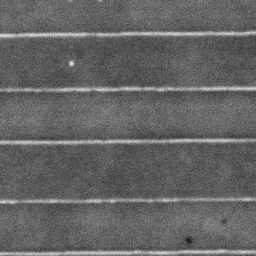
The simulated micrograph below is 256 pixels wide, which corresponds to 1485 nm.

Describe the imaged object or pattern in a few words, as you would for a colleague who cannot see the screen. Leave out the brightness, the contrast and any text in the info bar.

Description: lines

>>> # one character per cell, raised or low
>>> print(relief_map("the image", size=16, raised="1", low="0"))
0000000000000000
0000000000000000
1111111111111111
1111111111111111
1111111111111111
1111111111111111
0000000000000000
0000000000000000
0000000000000000
1111111111111111
1111111111111111
1111111111111111
1111111111110000
0000000000000000
0000000000000000
0000000000000000